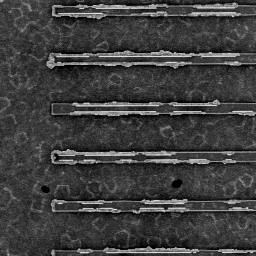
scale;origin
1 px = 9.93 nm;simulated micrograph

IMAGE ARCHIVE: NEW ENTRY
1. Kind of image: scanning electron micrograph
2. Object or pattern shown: parallel lines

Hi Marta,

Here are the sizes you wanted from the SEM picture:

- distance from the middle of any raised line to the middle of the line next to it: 0.485 micrometres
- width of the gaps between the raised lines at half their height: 0.373 µm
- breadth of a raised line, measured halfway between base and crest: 106 nm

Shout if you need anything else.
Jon